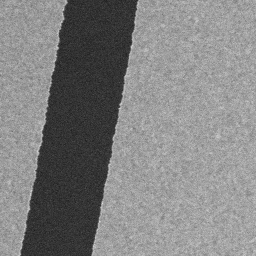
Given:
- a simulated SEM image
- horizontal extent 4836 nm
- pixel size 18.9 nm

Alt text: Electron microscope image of one or a few lines or trenches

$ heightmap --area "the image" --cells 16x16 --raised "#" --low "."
####.....#######
####....########
####....########
####....########
###.....########
###.....########
###.....########
###....#########
###....#########
##.....#########
##.....#########
##.....#########
##....##########
##....##########
##....##########
#.....##########